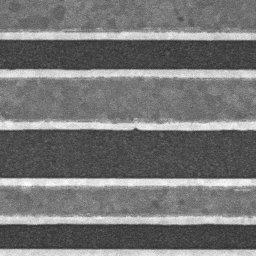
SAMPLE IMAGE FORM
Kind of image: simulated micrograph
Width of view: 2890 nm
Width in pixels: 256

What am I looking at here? one or a few lines or trenches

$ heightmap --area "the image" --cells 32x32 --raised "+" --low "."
++++++++++++++++++++++++++++++++
++++++++++++++++++++++++++++++++
++++++++++++++++++++++++++++++++
++++++++++++++++++++++++++++++++
................................
................................
................................
................................
................................
++++++++++++++++++++++++++++++++
++++++++++++++++++++++++++++++++
++++++++++++++++++++++++++++++++
++++++++++++++++++++++++++++++++
++++++++++++++++++++++++++++++++
++++++++++++++++++++++++++++++++
++++++++++++++++++++++++++++++++
................................
................................
................................
................................
................................
................................
................................
++++++++++++++++++++++++++++++++
++++++++++++++++++++++++++++++++
++++++++++++++++++++++++++++++++
++++++++++++++++++++++++++++++++
+..++.........++.....++......+++
................................
................................
................................
................................